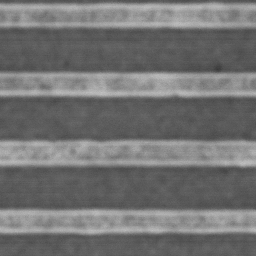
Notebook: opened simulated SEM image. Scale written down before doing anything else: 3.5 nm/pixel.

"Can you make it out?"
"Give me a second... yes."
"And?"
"one or a few lines or trenches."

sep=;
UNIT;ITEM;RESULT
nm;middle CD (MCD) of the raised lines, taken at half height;64.2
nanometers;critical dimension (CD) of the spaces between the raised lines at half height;176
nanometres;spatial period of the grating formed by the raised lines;240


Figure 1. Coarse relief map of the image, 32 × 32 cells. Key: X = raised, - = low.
--------------------------------
XXXXXXXXXXXXXXXXXXXXXXXXXXXXXXXX
XXXXXXXXXXXXXXXXXXXXXXXXXXXXXXXX
--------------------------------
--------------------------------
--------------------------------
--------------------------------
--------------------------------
--------------------------------
XXXXXXXXXXXXXXXXXXXXXXXXXXXXXXXX
XXXXXXXXXXXXXXXXXXXXXXXXXXXXXXXX
XXXXXXXXXXXXXXXXXXXXXXXXXXXXXXXX
--------------------------------
--------------------------------
--------------------------------
--------------------------------
--------------------------------
--------------------------------
XXXXXXXXXXXXXXXXXXXXXXXXXXXXXXXX
XXXXXXXXXXXXXXXXXXXXXXXXXXXXXXXX
--------------------------------
--------------------------------
--------------------------------
--------------------------------
--------------------------------
--------------------------------
--------------------------------
XXXXXXXXXXXXXXXXXXXXXXXXXXXXXXXX
XXXXXXXXXXXXXXXXXXXXXXXXXXXXXXXX
--------------------------------
--------------------------------
--------------------------------